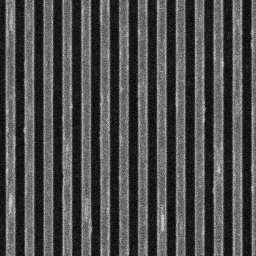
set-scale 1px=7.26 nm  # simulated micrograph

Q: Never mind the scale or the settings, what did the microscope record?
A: parallel lines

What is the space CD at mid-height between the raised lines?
70.8 nanometers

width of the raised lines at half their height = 8.75 px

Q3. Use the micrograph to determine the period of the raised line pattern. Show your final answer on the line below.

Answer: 0.137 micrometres